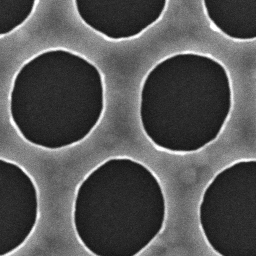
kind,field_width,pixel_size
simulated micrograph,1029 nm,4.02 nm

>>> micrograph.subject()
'holes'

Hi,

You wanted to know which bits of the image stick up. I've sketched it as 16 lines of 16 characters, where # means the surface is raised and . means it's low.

..###.....###...
.####....####...
################
##...######..###
#.....###.....##
#.....###.....##
#.....###.....##
#.....###.....##
##...####....###
################
.#####...#####..
..###.....###...
..###.....###...
..###.....###...
..###.....###...
.#####...####...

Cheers